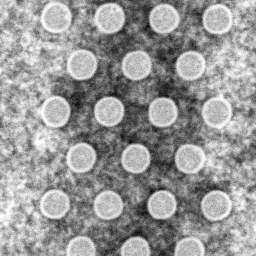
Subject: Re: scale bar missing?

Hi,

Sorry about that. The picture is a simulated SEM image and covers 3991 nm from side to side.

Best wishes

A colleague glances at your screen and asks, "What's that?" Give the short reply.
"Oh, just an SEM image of a regular array of raised bodies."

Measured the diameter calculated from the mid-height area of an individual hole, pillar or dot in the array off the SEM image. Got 0.439 µm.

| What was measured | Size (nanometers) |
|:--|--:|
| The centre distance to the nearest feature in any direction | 832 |